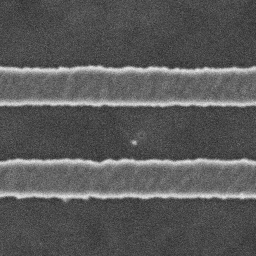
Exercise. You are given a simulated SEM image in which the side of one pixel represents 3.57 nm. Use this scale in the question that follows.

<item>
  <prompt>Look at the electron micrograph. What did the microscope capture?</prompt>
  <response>lines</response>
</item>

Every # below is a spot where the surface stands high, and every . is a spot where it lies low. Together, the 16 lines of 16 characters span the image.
................
................
................
................
################
################
################
................
................
................
################
################
................
................
................
................